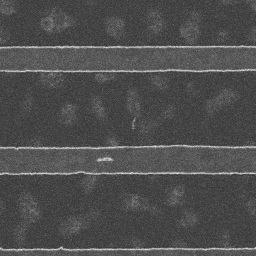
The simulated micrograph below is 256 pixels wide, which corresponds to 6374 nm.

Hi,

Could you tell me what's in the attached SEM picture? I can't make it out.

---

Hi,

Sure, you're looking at one or a few lines or trenches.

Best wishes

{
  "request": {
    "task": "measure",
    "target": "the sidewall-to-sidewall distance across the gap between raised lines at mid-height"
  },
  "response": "1890 nm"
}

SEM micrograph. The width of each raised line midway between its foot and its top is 626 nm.